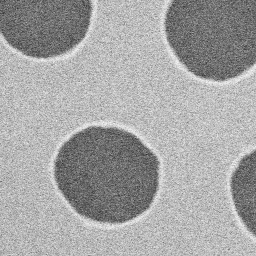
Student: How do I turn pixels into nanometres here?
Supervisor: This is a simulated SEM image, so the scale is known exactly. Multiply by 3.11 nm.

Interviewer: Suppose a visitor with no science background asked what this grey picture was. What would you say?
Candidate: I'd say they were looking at holes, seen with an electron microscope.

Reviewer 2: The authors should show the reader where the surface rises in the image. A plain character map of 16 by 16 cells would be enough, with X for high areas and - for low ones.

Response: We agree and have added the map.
------XXXX------
------XXXX------
-----XXXXX------
XX--XXXXXXX-----
XXXXXXXXXXXX---X
XXXXXXXXXXXXXXXX
XXXXXXXXXXXXXXXX
XXXXXXXXXXXXXXXX
XXXX----XXXXXXXX
XXXX------XXXXXX
XXX-------XXXXX-
XXX-------XXXX--
XXXX------XXXXX-
XXXXX----XXXXXX-
XXXXXXXXXXXXXXXX
XXXXXXXXXXXXXXXX